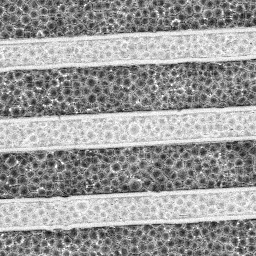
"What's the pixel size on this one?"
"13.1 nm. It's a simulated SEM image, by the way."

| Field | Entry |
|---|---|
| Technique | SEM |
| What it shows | one or a few lines or trenches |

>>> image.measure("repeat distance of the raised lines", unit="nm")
1050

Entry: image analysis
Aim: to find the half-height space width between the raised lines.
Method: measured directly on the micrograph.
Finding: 670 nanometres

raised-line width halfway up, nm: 367